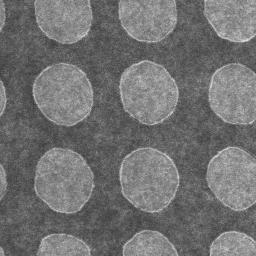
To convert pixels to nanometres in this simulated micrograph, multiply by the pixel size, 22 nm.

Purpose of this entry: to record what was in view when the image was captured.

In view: raised bodies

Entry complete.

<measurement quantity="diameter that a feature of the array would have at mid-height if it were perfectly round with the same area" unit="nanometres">1320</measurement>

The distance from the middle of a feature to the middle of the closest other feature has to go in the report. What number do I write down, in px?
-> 85.4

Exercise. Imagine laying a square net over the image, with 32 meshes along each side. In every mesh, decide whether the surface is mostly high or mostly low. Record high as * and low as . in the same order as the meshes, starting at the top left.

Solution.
....*******....*******....******
*....******....*.*****....******
*....******....*******....******
.....******.....******.....*****
......****.......****.......****
................................
................................
................................
......****......*****.......***.
.....******....******......*****
....*******....*******....******
*...********...*******....******
*...********...*******....******
*....******.....******....******
......*****......****......*****
.......**.........*.............
................................
................................
............................**..
......****......*****......****.
.....******....*******....******
*.....*****....*******....******
*...********...*******....******
*...*******....*******....******
.....******.....******.....*****
......****.......****.......***.
........*.......................
................................
................................
......***........****.......***.
.....******.....*****......*****
.....*.****....*******....******